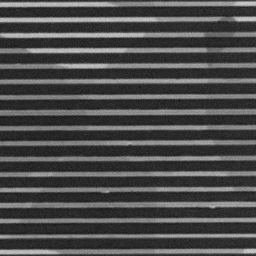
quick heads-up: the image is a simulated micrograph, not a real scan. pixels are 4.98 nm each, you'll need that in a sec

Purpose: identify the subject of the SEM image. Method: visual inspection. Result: parallel lines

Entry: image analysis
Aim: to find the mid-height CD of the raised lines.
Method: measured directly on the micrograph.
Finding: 4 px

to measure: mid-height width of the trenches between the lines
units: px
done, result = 11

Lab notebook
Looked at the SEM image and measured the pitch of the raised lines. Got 76.9 nanometers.